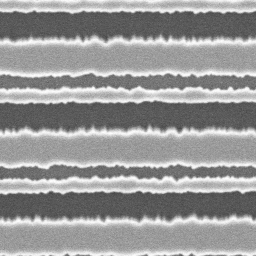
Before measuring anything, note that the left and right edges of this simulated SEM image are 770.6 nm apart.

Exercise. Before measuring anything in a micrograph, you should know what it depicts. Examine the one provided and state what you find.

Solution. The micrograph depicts lines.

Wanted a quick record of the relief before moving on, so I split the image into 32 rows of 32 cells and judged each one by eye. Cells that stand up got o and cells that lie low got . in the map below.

oooooooooooooooooooooooooooooooo
.........o..............o.....o.
................................
................................
................................
oooooooooooooooooooooooooooooooo
oooooooooooooooooooooooooooooooo
oooooooooooooooooooooooooooooooo
oooooooooooooooooooooooooooooooo
oooooooooooooooooooooooooooooooo
oooooooooooooooooooooooooooooooo
oooooooooooooooooooooooooooooooo
oooooooooooooooooooooooooooooooo
................................
................................
................................
..oo.o....ooooo.oooo.o.oooooo..o
oooooooooooooooooooooooooooooooo
oooooooooooooooooooooooooooooooo
oooooooooooooooooooooooooooooooo
oooooooooooooooooooooooooooooooo
oooooooooooooooooooooooooooooooo
oooooooooooooooooooooooooooooooo
oooooooooooooooooooooooooooooooo
................................
................................
................................
....o.............o...oooo..ooo.
oooooooooooooooooooooooooooooooo
oooooooooooooooooooooooooooooooo
oooooooooooooooooooooooooooooooo
oooooooooooooooooooooooooooooooo